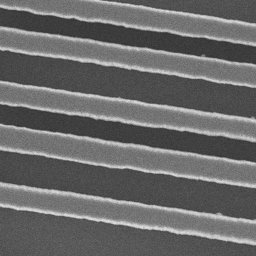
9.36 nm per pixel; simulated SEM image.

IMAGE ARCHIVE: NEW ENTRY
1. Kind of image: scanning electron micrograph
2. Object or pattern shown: lines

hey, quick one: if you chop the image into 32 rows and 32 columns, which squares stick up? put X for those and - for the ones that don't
XXXXXXXXXXXXXXXX----------------
---XXXXXXXXXXXXXXXXXXX----------
----------XXXXXXXXXXXXXXXXXXX---
X---------------XXXXXXXXXXXXXXXX
XXXXXXXX---------------XXXXXXXXX
XXXXXXXXXXXXXXX---------------XX
--XXXXXXXXXXXXXXXXXXX-----------
---------XXXXXXXXXXXXXXXXXXX----
---------------XXXXXXXXXXXXXXXXX
----------------------XXXXXXXXXX
XX---------------------------XXX
XXXXXXXXX-----------------------
XXXXXXXXXXXXXXXXX---------------
----XXXXXXXXXXXXXXXXXXX---------
----------XXXXXXXXXXXXXXXXXXXX--
-----------------XXXXXXXXXXXXXXX
XXXXXXX-----------------XXXXXXXX
XXXXXXXXXXXXX-----------------XX
XXXXXXXXXXXXXXXXXXX-------------
-----XXXXXXXXXXXXXXXXXXXXX------
-----------XXXXXXXXXXXXXXXXXXXXX
------------------XXXXXXXXXXXXXX
-------------------------XXXXXXX
XXXXX---------------------------
XXXXXXXXXXXX--------------------
XXXXXXXXXXXXXXXXXX--------------
-----XXXXXXXXXXXXXXXXXXXX-------
-----------XXXXXXXXXXXXXXXXXXXXX
------------------XXXXXXXXXXXXXX
-------------------------XXXXXXX
-------------------------------X
--------------------------------